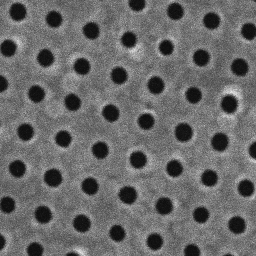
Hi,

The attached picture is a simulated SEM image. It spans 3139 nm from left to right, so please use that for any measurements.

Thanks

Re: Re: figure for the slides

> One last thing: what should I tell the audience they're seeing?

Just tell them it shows a regular array of holes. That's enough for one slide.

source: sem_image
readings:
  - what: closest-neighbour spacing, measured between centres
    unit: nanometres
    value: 455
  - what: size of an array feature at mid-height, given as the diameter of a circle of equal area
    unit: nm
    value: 220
